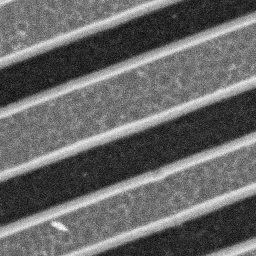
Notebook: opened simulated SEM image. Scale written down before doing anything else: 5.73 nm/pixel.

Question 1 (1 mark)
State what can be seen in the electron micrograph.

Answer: one or a few lines or trenches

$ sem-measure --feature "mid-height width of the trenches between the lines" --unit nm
287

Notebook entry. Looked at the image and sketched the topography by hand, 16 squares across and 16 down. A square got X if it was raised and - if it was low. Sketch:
XXXXXXXXX-------
XXXXXXX--------X
XXXX--------XXXX
X--------XXXXXXX
-------XXXXXXXXX
----XXXXXXXXXXX-
-XXXXXXXXXXX----
XXXXXXXXXX------
XXXXXXX---------
XXXX---------XXX
XX---------XXXXX
--------XXXXXXXX
-----XXXXXXXXX--
---XXXXXXXXX----
XXXXXXXXX-------
XXXXXX---------X